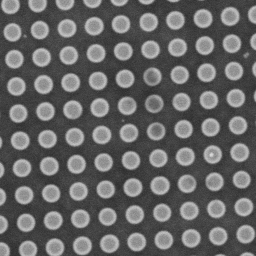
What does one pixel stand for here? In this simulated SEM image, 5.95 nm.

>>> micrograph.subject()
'an array of small figures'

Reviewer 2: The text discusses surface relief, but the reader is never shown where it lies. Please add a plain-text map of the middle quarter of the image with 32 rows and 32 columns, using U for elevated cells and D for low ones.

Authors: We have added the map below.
DDDDDDDDDDDDDDDDDDDDDDDDDDDDDDDD
DDDDDDDDDDDDDDDDDDDDDUUUDDDUUUUD
DUDDDDDUUUDDDUUUUDDDUUUUDDDUUUUD
UUUUDDUUUUUDDUUUUDDDUUUUDDDUUUUD
UUUUDDUUUUUDDUUUUDDDUUUUDDDDUUDD
UUUUDDDUUUDDDDUUUDDDDDDDDDDDDDDD
UUUDDDDDDDDDDDDDDDDDDDDDDDDDDDDD
DDDDDDDDDDDDDDDDDDDDDDDDDDDDUUDD
DDDDDDDDDDDDDDDUUDDDDUUUDDDUUUUD
DUUUDDDUUUUDDDUUUUDDUUUUUDDUUUUD
UUUUDDDUUUUDDDUUUUDDUUUUUDDUUUUD
UUUUDDDUUUUDDDUUUUDDDUUUDDDDUUDD
UUUUDDDUUUUDDDDUUDDDDDDDDDDDDDDD
DUUDDDDDDDDDDDDDDDDDDDDDDDDDDDDD
DDDDDDDDDDDDDDDDDDDDDDDDDDDDDUUD
DDDDDDDDDDDDDDDUUUDDDUUUUDDDUUUU
DUUUDDDDUUUDDDUUUUDDDUUUUDDDUUUU
DUUUUDDUUUUUDDUUUUDDDUUUUDDDUUUU
UUUUUDDUUUUUDDUUUUDDDDUUDDDDDDDD
DUUUUDDDUUUDDDDDDDDDDDDDDDDDDDDD
DDDDDDDDDDDDDDDDDDDDDDDDDDDDDDDD
DDDDDDDDDDDDDDDDDDDDDDDUDDDDDUUU
DDDDDDDDDDUDDDDUUUDDDDUUUUDDUUUU
DUUUUDDDUUUUDDDUUUUDDUUUUUDDUUUU
DUUUUDDDUUUUDDDUUUUDDDUUUUDDUUUU
DUUUUDDDUUUUDDDUUUUDDDDUUDDDDDDD
DUUUUDDDDUUDDDDDDDDDDDDDDDDDDDDD
DDDDDDDDDDDDDDDDDDDDDDDDDDDDDDDD
DDDDDDDDDDDDDDDDDDDDDDDUUDDDDUUU
DDDDDDDDDUUDDDDUUUUDDDUUUUDDDUUU
DDUUUDDDUUUUDDDUUUUDDDUUUUDDDUUU
DUUUUUDDUUUUUDDUUUUDDDUUUUDDDUUU